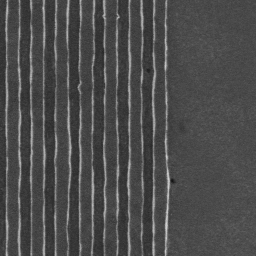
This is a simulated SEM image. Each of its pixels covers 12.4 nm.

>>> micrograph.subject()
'parallel lines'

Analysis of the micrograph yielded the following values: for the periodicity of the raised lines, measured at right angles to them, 0.304 µm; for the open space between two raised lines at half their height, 137 nm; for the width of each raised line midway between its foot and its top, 165 nanometres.